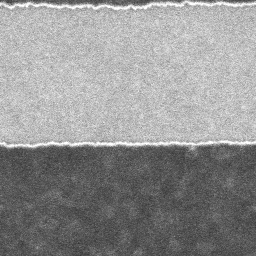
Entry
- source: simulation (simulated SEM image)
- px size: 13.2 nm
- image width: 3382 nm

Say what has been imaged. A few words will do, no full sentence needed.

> one or a few lines or trenches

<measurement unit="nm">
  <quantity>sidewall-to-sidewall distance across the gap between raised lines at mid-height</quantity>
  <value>1810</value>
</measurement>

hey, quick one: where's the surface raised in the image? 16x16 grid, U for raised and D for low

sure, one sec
DDDDDDDUUDDDDDDD
DDDDDDDDDDDDDDDD
DDDDDDDDDDDDDDDD
DDDDDDDDDDDDDDDD
DDDDDDDDDDDDDDDD
DDDDDDDDDDDDDDDD
DDDDDDDDDDDDDDDD
DDDDDDDDDDDDDDDD
DDDDDDDDDDDDDDDD
UUUUUUUUUUUUUUUU
UUUUUUUUUUUUUUUU
UUUUUUUUUUUUUUUU
UUUUUUUUUUUUUUUU
UUUUUUUUUUUUUUUU
UUUUUUUUUUUUUUUU
UUUUUUUUUUUUUUUU